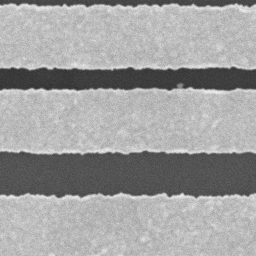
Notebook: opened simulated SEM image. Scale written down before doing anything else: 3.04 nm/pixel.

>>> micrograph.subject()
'lines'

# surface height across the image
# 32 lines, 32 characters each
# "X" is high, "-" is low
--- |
--------------------------------
XXXXXXXXXXXXXXXXXXXXXXXXXXXXXXXX
XXXXXXXXXXXXXXXXXXXXXXXXXXXXXXXX
XXXXXXXXXXXXXXXXXXXXXXXXXXXXXXXX
XXXXXXXXXXXXXXXXXXXXXXXXXXXXXXXX
XXXXXXXXXXXXXXXXXXXXXXXXXXXXXXXX
XXXXXXXXXXXXXXXXXXXXXXXXXXXXXXXX
XXXXXXXXXXXXXXXXXXXXXXXXXXXXXXXX
---XX-XXXXXXXXX--X-XXXX-------XX
--------------------------------
--------------------------------
XXXXXXXXXXXXXXXXXXXXXXXXXXXXXXXX
XXXXXXXXXXXXXXXXXXXXXXXXXXXXXXXX
XXXXXXXXXXXXXXXXXXXXXXXXXXXXXXXX
XXXXXXXXXXXXXXXXXXXXXXXXXXXXXXXX
XXXXXXXXXXXXXXXXXXXXXXXXXXXXXXXX
XXXXXXXXXXXXXXXXXXXXXXXXXXXXXXXX
XXXXXXXXXXXXXXXXXXXXXXXXXXXXXXXX
XXXXXXXXXXXXXXXXXXXXXXXXXXXXXXXX
--------------------------------
--------------------------------
--------------------------------
--------------------------------
--------------------------------
XX-XX---X--XX-XXX--XX-XX----XX-X
XXXXXXXXXXXXXXXXXXXXXXXXXXXXXXXX
XXXXXXXXXXXXXXXXXXXXXXXXXXXXXXXX
XXXXXXXXXXXXXXXXXXXXXXXXXXXXXXXX
XXXXXXXXXXXXXXXXXXXXXXXXXXXXXXXX
XXXXXXXXXXXXXXXXXXXXXXXXXXXXXXXX
XXXXXXXXXXXXXXXXXXXXXXXXXXXXXXXX
XXXXXXXXXXXXXXXXXXXXXXXXXXXXXXXX